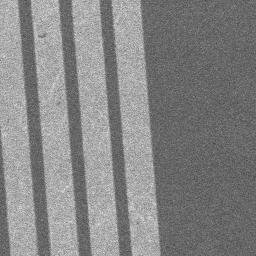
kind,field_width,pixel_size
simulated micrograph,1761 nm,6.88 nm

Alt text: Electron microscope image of parallel lines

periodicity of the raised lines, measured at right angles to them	0.277	um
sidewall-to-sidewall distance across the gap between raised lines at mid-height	92.6	nm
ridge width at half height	184	nm